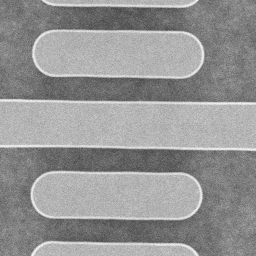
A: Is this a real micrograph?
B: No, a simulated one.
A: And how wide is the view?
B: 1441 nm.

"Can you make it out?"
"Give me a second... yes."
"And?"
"groups of lines, slits or small figures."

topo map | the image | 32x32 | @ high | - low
------@@@@@@@@@@@@@@@@@@--------
--------------------------------
--------------------------------
--------------------------------
-----@@@@@@@@@@@@@@@@@@@--------
----@@@@@@@@@@@@@@@@@@@@@-------
----@@@@@@@@@@@@@@@@@@@@@-------
----@@@@@@@@@@@@@@@@@@@@@-------
-----@@@@@@@@@@@@@@@@@@@@-------
-------------@@@@@@@@@@@--------
--------------------------------
--------------------------------
--------------------------------
@@@@@@@@@@@@@@@@@@@@@@@@@@@@@@@@
@@@@@@@@@@@@@@@@@@@@@@@@@@@@@@@@
@@@@@@@@@@@@@@@@@@@@@@@@@@@@@@@@
@@@@@@@@@@@@@@@@@@@@@@@@@@@@@@@@
@@@@@@@@@@@@@@@@@@@@@@@@@@@@@@@@
--------------------@@@@@@@@@@@@
--------------------------------
--------------------------------
--------------------------------
-----@@@@@@@@@@@@@@@@@@@--------
----@@@@@@@@@@@@@@@@@@@@@-------
----@@@@@@@@@@@@@@@@@@@@@-------
----@@@@@@@@@@@@@@@@@@@@@-------
-----@@@@@@@@@@@@@@@@@@@--------
--------------------------------
--------------------------------
--------------------------------
-----@@@@@@@@@------------------
----@@@@@@@@@@@@@@@@@@@@--------